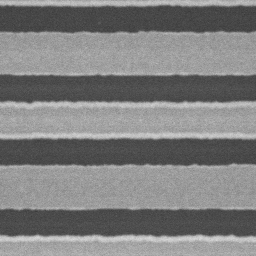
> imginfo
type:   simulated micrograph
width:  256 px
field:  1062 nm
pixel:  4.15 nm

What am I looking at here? lines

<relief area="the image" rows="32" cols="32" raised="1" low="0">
01111101111110111111001111011100
00000000000000000000000000000000
00000000000000000000000000000000
00000000000000000000000000000000
11111111111111111111111111111111
11111111111111111111111111111111
11111111111111111111111111111111
11111111111111111111111111111111
11111111111111111111111111111111
00000000000000000000000000000000
00000000000000000000000000000000
00000000000000000000000000000000
00000000000000000000000000000000
11111111111111111111111111111111
11111111111111111111111111111111
11111111111111111111111111111111
11111111111111111111111111111111
00000000000000000000000000000000
00000000000000000000000000000000
00000000000000000000000000000000
00000000000000000000000000000000
11111111111111111111111111111111
11111111111111111111111111111111
11111111111111111111111111111111
11111111111111111111111111111111
11111111111111111111111111111111
00000000000000000000000000000000
00000000000000000000000000000000
00000000000000000000000000000000
00000000000000000000000000000000
11111111111111111111111111111111
11111111111111111111111111111111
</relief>